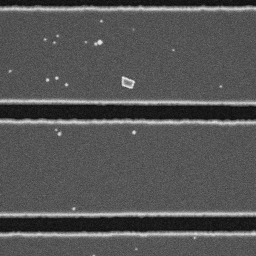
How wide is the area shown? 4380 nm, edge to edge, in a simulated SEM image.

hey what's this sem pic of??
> lines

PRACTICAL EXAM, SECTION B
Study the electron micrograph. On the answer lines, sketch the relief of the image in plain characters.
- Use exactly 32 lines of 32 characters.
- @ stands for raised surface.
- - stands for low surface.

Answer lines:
--------------------------------
@@@@@@@@@@@@@@@@@@@@@@@@@@@@@@@@
@@@@@@@@@@@@@@@@@@@@@@@@@@@@@@@@
@@@@@@@@@@@@@@@@@@@@@@@@@@@@@@@@
@@@@@@@@@@@@@@@@@@@@@@@@@@@@@@@@
@@@@@@@@@@@@@@@@@@@@@@@@@@@@@@@@
@@@@@@@@@@@@@@@@@@@@@@@@@@@@@@@@
@@@@@@@@@@@@@@@@@@@@@@@@@@@@@@@@
@@@@@@@@@@@@@@@@@@@@@@@@@@@@@@@@
@@@@@@@@@@@@@@@@@@@@@@@@@@@@@@@@
@@@@@@@@@@@@@@@@@@@@@@@@@@@@@@@@
@@@@@@@@@@@@@@@@@@@@@@@@@@@@@@@@
@@@@@@@@@@@@@@@@@@@@@@@@@@@@@@@@
--------------------------------
--------------------------------
@@@@@@@@@@@@@@@@@@@@@@@@@@@@@@@@
@@@@@@@@@@@@@@@@@@@@@@@@@@@@@@@@
@@@@@@@@@@@@@@@@@@@@@@@@@@@@@@@@
@@@@@@@@@@@@@@@@@@@@@@@@@@@@@@@@
@@@@@@@@@@@@@@@@@@@@@@@@@@@@@@@@
@@@@@@@@@@@@@@@@@@@@@@@@@@@@@@@@
@@@@@@@@@@@@@@@@@@@@@@@@@@@@@@@@
@@@@@@@@@@@@@@@@@@@@@@@@@@@@@@@@
@@@@@@@@@@@@@@@@@@@@@@@@@@@@@@@@
@@@@@@@@@@@@@@@@@@@@@@@@@@@@@@@@
@@@@@@@@@@@@@@@@@@@@@@@@@@@@@@@@
@@@@@@@@@@@@@@@@@@@@@@@@@@@@@@@@
--------------------------------
--------------------------------
@@@@@@@@@@@@@@@@@@@@@@@@@@@@@@@@
@@@@@@@@@@@@@@@@@@@@@@@@@@@@@@@@
@@@@@@@@@@@@@@@@@@@@@@@@@@@@@@@@